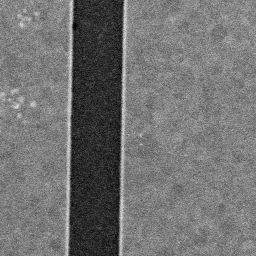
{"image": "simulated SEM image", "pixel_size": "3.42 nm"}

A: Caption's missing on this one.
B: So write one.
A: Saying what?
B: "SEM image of one or a few lines or trenches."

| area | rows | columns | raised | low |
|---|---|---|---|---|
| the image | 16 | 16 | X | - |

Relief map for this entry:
XXXX----XXXXXXXX
XXXX----XXXXXXXX
XXXX----XXXXXXXX
XXXX----XXXXXXXX
XXXX----XXXXXXXX
XXXX----XXXXXXXX
XXXX----XXXXXXXX
XXXX----XXXXXXXX
XXXX----XXXXXXXX
XXXX----XXXXXXXX
XXXX----XXXXXXXX
XXXX----XXXXXXXX
XXXX----XXXXXXXX
XXXX----XXXXXXXX
XXXX----XXXXXXXX
XXXX----XXXXXXXX